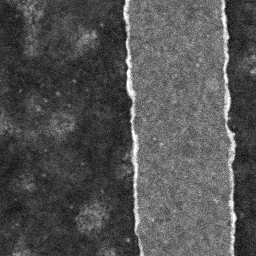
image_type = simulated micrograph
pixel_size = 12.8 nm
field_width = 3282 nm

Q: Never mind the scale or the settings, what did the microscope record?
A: one or a few lines or trenches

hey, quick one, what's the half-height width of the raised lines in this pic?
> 1.25 micrometres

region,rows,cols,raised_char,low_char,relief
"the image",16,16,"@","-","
--------@@@@@@--
--------@@@@@@--
--------@@@@@@--
--------@@@@@@--
--------@@@@@@--
--------@@@@@@--
--------@@@@@@--
--------@@@@@@--
--------@@@@@@@-
--------@@@@@@@-
--------@@@@@@--
--------@@@@@@@-
--------@@@@@@@-
---------@@@@@@-
---------@@@@@@-
---------@@@@@@-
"